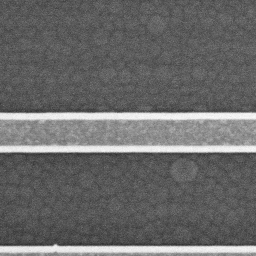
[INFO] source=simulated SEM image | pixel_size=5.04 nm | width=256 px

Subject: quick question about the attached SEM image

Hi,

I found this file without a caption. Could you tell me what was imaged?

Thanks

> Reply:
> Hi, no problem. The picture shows one or a few lines or trenches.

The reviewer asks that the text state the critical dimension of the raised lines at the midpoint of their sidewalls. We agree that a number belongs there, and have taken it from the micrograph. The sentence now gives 32.7 px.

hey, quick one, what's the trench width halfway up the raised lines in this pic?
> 508 nm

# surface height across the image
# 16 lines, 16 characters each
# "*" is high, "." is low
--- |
................
................
................
................
................
................
................
****************
****************
................
................
................
................
................
................
................